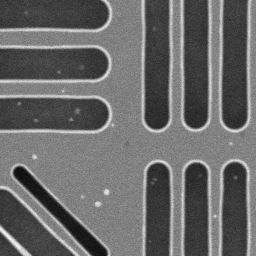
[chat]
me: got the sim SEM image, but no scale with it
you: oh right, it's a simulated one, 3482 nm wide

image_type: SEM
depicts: groups of lines, slits or small figures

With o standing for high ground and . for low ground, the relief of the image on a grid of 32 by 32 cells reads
.............ooooo...oo...oo...o
..............oooo...oo...oo...o
..............oooo...oo...oo...o
.............ooooo...oo...oo...o
oooooooooooooooooo...oo...oo...o
oooooooooooooooooo...oo...oo...o
.............ooooo...oo...oo...o
..............oooo...oo...oo...o
..............oooo...oo...oo...o
.............ooooo...oo...oo...o
oooooooooooooooooo...oo...oo...o
oooooooooooooooooo...oo...oo...o
.............ooooo...oo...oo...o
..............oooo...oo...oo...o
..............oooo...oo...oo...o
.............ooooo...oo...oo...o
oooooooooooooooooooooooooooooooo
oooooooooooooooooooooooooooooooo
oooooooooooooooooooooooooooooooo
oooooooooooooooooooooooooooooooo
ooooooooooooooooooo..ooo.ooo..oo
oo..oooooooooooooo...oo...oo...o
oo...ooooooooooooo...oo...oo...o
ooo...oooooooooooo...oo...oo...o
..oo...ooooooooooo...oo...oo...o
...oo...oooooooooo...oo...oo...o
....oo...ooooooooo...oo...oo...o
.....oo...oooooooo...oo...oo...o
......oo...ooooooo...oo...oo...o
.......oo...oooooo...oo...oo...o
........oo...ooooo...oo...oo...o
.........oo..ooooo...oo...oo...o